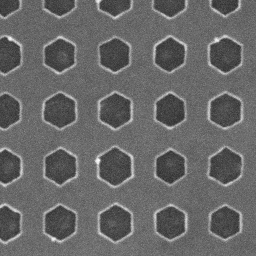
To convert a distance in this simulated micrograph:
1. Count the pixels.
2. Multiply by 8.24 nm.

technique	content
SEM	a regular array of holes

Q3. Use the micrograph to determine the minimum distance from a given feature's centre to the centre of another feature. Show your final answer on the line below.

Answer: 453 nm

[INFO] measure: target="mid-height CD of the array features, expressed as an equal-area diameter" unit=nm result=271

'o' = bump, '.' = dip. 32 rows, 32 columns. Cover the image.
...oo....ooo....ooo....ooo....oo
..oooo...oooo...oooo...oooo..ooo
oooooooooooooooooooooooooooooooo
oooooooooooooooooooooooooooooooo
oooooooooooooooooooooooooooooooo
..oooo...oooo...oooo...oooo...oo
...oo....ooo....ooo....ooo....oo
...oo....ooo....ooo....ooo....oo
..oooo...oooo..ooooo..ooooo..ooo
oooooooooooooooooooooooooooooooo
oooooooooooooooooooooooooooooooo
oooooooooooooooooooooooooooooooo
..oooo...oooo...oooo...oooo...oo
..ooo....ooo....ooo....ooo....oo
..ooo.....oo....ooo....ooo....oo
..oooo...oooo...oooo..ooooo..ooo
oooooooooooooooooooooooooooooooo
oooooooooooooooooooooooooooooooo
oooooooooooooo.ooooooooooooooooo
..oooo...oooo...oooo...oooo...oo
...ooo....oo....ooo....ooo....oo
...ooo....oo....ooo....ooo....oo
..oooo...oooo...oooo..ooooo..ooo
oooooooooooooooooooooooooooooooo
oooooooooooooooooooooooooooooooo
oooooooooooooooooooooooooooooooo
..oooo...oooo...oooo...oooo...oo
...ooo....oo.....oo....ooo....oo
...ooo...ooo.....ooo...ooo....oo
..oooo...oooo...oooo..ooooo..ooo
oooooooooooooooooooooooooooooooo
oooooooooooooooooooooooooooooooo